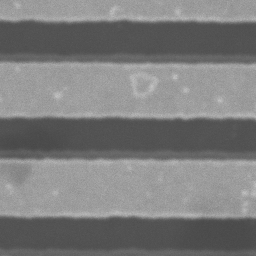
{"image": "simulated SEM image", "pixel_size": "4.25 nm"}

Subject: lines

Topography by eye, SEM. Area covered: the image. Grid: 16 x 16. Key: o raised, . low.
oooooooooooooooo
................
................
................
oooooooooooooooo
oooooooooooooooo
oooooooooooooooo
................
................
................
oooooooooooooooo
oooooooooooooooo
oooooooooooooooo
.ooooooooooooooo
................
................